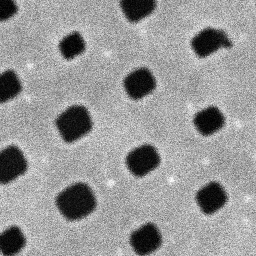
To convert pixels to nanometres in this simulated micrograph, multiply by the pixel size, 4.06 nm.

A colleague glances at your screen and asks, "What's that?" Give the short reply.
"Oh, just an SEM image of a regular array of holes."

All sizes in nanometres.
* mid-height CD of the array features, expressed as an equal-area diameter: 134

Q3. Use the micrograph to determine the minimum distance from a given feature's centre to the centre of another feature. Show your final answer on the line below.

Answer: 313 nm